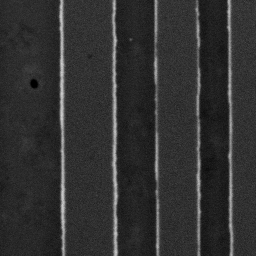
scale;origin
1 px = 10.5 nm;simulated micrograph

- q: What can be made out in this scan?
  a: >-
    lines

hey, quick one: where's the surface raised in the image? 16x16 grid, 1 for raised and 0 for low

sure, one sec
0000111000110011
0000111000110011
0000111000110011
0000111000110011
0000111000110011
0000111000110011
0000111000110011
0000111000110011
0000111000110011
0000111000110011
0000111000110011
0000111000110011
0000111000110011
0000111000110011
0000111000110011
0000111000110011